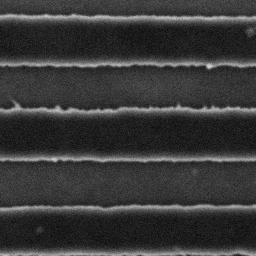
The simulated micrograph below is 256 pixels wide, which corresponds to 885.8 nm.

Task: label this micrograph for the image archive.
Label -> lines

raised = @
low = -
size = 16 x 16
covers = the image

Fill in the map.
----------------
@@@@@@@@@@@@@@@@
@@@@@@@@@@@@@@@@
@@@@@@@@@@@@@@@@
----------------
----------------
----------------
@@@@@@@@@@@@@@@@
@@@@@@@@@@@@@@@@
@@@@@@@@@@@@@@@@
----------------
----------------
----------------
@@@@@@@@@@@@@@@@
@@@@@@@@@@@@@@@@
@@@@@@@@@@@@@@@@